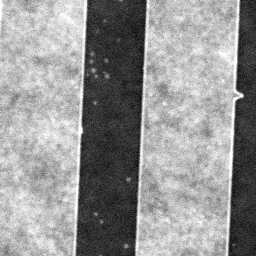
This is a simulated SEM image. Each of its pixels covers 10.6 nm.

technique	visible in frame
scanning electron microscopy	one or a few lines or trenches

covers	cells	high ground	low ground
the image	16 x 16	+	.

+++++....++++++.
+++++....++++++.
+++++....++++++.
+++++....++++++.
+++++....++++++.
+++++....++++++.
+++++....++++++.
+++++....++++++.
+++++....++++++.
+++++....+++++..
+++++....+++++..
+++++....+++++..
+++++....+++++..
+++++....+++++..
+++++....+++++..
+++++....+++++..